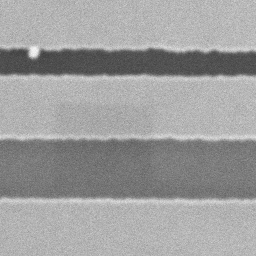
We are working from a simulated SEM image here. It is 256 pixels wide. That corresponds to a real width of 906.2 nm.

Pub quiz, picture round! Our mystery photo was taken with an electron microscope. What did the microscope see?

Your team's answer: lines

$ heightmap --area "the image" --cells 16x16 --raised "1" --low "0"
1111111111111111
1111111111111111
1111111111111111
0000000000000000
0000000000000000
1111111111111111
1111111111111111
1111111111111111
1111111111111111
0000000000000000
0000000000000000
0000000000000000
1111111111111111
1111111111111111
1111111111111111
1111111111111111